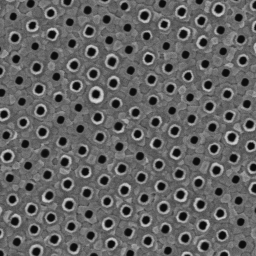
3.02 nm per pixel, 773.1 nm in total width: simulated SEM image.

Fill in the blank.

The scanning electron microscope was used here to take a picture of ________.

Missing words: a regular array of holes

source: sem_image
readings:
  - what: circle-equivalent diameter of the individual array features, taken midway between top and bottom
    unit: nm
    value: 22.8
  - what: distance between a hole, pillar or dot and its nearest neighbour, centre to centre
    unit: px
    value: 20.8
